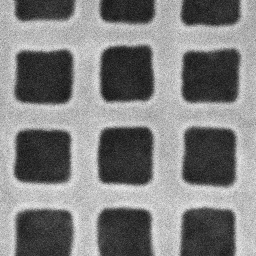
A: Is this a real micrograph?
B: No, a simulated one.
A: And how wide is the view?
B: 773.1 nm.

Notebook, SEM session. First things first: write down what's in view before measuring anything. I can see holes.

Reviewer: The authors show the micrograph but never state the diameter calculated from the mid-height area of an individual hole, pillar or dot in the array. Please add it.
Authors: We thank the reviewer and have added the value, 186 nanometers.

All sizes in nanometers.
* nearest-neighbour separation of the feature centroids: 244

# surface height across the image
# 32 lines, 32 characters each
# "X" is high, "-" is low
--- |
XX-------XXX--------XXX-------XX
XX-------XXX-------XXXX-------XX
XX------XXXXX------XXXX-------XX
XXXXXXXXXXXXXXXXXXXXXXXXXXXXXXXX
XXXXXXXXXXXXXXXXXXXXXXXXXXXXXXXX
XXXXXXXXXXXXXXXXXXXXXXXXXXXXXXXX
XX-------XXXX------XXXX-------XX
XX-------XXXX------XXXX-------XX
XX-------XXXX------XXXX-------XX
XX-------XXX-------XXXX-------XX
XX-------XXX-------XXXX-------XX
XX-------XXXX------XXXX-------XX
XX-------XXXX------XXXX------XXX
XXXXXXXXXXXXXXXXXXXXXXXXXXXXXXXX
XXXXXXXXXXXXXXXXXXXXXXXXXXXXXXXX
XXXXXXXXXXXXXXXXXXXXXXXXXXXXXXXX
XX------XXXXX------XXXX------XXX
XX-------XXX-------XXXX-------XX
XX-------XXX-------XXXX-------XX
XX-------XXX-------XXXX-------XX
XX-------XXX-------XXXX-------XX
XX-------XXX-------XXXX-------XX
XX-------XXX-------XXXX-------XX
XXXXXXXXXXXXXXXXXXXXXXXXXXXXXXXX
XXXXXXXXXXXXXXXXXXXXXXXXXXXXXXXX
XXXXXXXXXXXXXXXXXXXXXXXXXXXXXXXX
XXX------XXXX------XXXX------XXX
XX-------XXX-------XXXX------XXX
XX-------XXX-------XXXX------XXX
XX-------XXX-------XXX-------XXX
XX-------XXX-------XXX--------XX
XX-------XXX-------XXX-------XXX